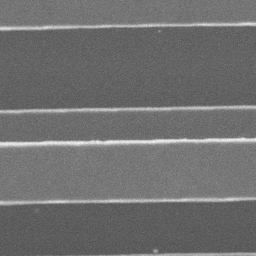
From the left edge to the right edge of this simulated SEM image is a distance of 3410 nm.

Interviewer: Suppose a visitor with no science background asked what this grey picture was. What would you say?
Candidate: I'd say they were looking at lines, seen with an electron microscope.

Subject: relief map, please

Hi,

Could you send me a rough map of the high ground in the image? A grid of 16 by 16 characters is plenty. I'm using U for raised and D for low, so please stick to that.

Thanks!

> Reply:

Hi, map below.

UUUUUUUUUUUUUUUU
UUUUUUUUUUUUUUDD
DDDDDDDDDDDDDDDD
DDDDDDDDDDDDDDDD
DDDDDDDDDDDDDDDD
DDDDDDDDDDDDDDDD
DDDDDDDDDDDDDDDD
DDDDDDDDDDDDDDDD
DDDDDDDDDDDDDDDD
UUUUUUUUUUUUUUUU
UUUUUUUUUUUUUUUU
UUUUUUUUUUUUUUUU
UUUUUUUUUUUUDDDD
DDDDDDDDDDDDDDDD
DDDDDDDDDDDDDDDD
DDDDDDDDDDDDDDDD